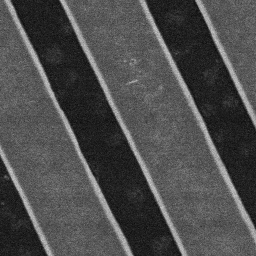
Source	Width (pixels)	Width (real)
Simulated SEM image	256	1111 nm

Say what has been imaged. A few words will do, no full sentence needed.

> one or a few lines or trenches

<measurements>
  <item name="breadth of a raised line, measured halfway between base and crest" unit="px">72.8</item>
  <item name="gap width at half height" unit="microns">0.211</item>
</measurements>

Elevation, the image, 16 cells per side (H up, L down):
HLLLHHHHHLLLLHHH
HLLLLHHHHHLLLHHH
HHLLLHHHHHLLLHHH
HHLLLLHHHHHLLLHH
HHHLLLHHHHHLLLHH
HHHLLLLHHHHHLLLH
HHHHLLLHHHHHLLLH
HHHHLLLHHHHHHLLL
HHHHHLLLHHHHHLLL
HHHHHLLLHHHHHLLL
LHHHHLLLLHHHHHLL
LHHHHHLLLHHHHHLL
LLHHHHLLLLHHHHHL
LLHHHHHLLLHHHHHL
LLHHHHHLLLLHHHHH
LLLHHHHHLLLHHHHH